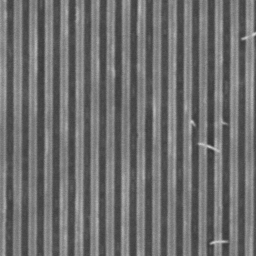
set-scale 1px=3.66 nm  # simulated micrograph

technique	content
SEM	parallel lines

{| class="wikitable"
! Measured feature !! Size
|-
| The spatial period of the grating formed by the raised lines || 15.5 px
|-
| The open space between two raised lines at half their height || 28.9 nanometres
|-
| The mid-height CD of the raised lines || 6.89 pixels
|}